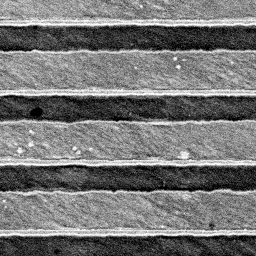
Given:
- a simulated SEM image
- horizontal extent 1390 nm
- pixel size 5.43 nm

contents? lines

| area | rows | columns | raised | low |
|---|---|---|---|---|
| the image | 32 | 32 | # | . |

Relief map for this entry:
################################
################################
################################
................................
................................
................................
....#....##....####.#.##########
################################
################################
################################
################################
################################
................................
................................
................................
################################
################################
################################
################################
################################
################################
................................
................................
................................
################################
################################
################################
################################
################################
................................
................................
................................